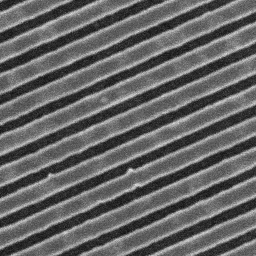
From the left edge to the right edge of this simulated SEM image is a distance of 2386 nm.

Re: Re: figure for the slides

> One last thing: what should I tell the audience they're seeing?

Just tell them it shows parallel lines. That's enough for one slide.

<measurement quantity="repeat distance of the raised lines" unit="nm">264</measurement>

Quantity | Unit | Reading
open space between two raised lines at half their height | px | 11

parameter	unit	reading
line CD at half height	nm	166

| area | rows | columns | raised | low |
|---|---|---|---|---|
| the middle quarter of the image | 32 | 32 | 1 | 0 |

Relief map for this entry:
00000011111111111000000011111111
00001111111111100000011111111111
00111111111110000001111111111100
11111111110000000111111111110000
11111111000000111111111110000000
11111100000011111111111000000011
11110000001111111111100000001111
10000000111111111100000001111111
00000111111111110000000111111111
00011111111111000000011111111111
01111111111100000001111111111100
11111111100000000111111111110000
11111110000000111111111110000000
11111000000011111111111000000011
11100000001111111111100000001111
10000001111111111100000001111111
00000111111111110000000111111111
00011111111111000000011111111110
01111111111000000001111111111000
11111111100000001111111111100000
11111110000000111111111100000001
11111000000011111111110000000111
11100000001111111111000000011111
00000001111111111100000011111111
00000111111111100000001111111111
00011111111110000000111111111110
11111111111000001111111111111000
11111111100000011111111111000000
11111100000001111111111000000011
11110000000111111111100000001111
11000000011111111100000000111111
00000011111111111000000011111111